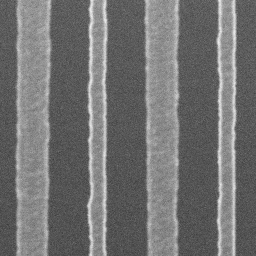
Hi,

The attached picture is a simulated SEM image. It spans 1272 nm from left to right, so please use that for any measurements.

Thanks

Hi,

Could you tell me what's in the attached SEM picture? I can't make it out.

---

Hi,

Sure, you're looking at lines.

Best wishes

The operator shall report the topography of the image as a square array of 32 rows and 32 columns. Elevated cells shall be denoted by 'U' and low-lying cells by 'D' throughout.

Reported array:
DDUUUUDDDDDUUDDDDDUUUUDDDDDUUDDD
DDUUUUDDDDDUUDDDDDUUUUDDDDDUUDDD
DDUUUUDDDDDUUDDDDDUUUUDDDDDUUDDD
DDDUUUDDDDDUUDDDDDUUUUDDDDDUUDDD
DDDUUUDDDDDUUDDDDDUUUUDDDDDUUDDD
DDUUUUDDDDDUUDDDDDUUUUDDDDDUUDDD
DDUUUUDDDDDUUDDDDDUUUUDDDDDUUDDD
DDUUUUDDDDDUUDDDDDDUUUDDDDDUUDDD
DDUUUUDDDDDUUDDDDDUUUUDDDDDUUDDD
DDUUUUDDDDDUUDDDDDDUUUDDDDDUUDDD
DDUUUUDDDDDUUDDDDDDUUUDDDDDDUDDD
DDUUUUDDDDDUUDDDDDDUUUDDDDDUUDDD
DDUUUUDDDDDUUDDDDDDUUUDDDDDUUDDD
DDUUUUDDDDDUUDDDDDDUUUDDDDDUUDDD
DDUUUUDDDDDUUDDDDDDUUUDDDDDUUDDD
DDUUUUDDDDDUUDDDDDDUUUDDDDDUUDDD
DDUUUUDDDDDUUDDDDDDUUUDDDDDUUDDD
DDUUUUDDDDDUUDDDDDDUUUDDDDDUUDDD
DDUUUUDDDDDUUDDDDDDUUUDDDDDUUDDD
DDUUUUDDDDDUUDDDDDDUUUDDDDDUUDDD
DDUUUUDDDDDUUDDDDDDUUUDDDDDUUDDD
DDUUUUDDDDDUUDDDDDDUUUDDDDDUUDDD
DDUUUUDDDDDUUDDDDDDUUUDDDDDUUDDD
DDUUUUDDDDDUUDDDDDDUUUDDDDDUUDDD
DDUUUUDDDDDUUDDDDDDUUUDDDDDUUDDD
DDUUUUDDDDDUUDDDDDDUUUDDDDDUUDDD
DDUUUUDDDDDUUDDDDDDUUUDDDDDUUDDD
DDUUUUDDDDDUUDDDDDDUUUDDDDDUUDDD
DDUUUUDDDDDUUDDDDDDUUUDDDDDUUDDD
DDUUUUDDDDDUUDDDDDDUUUDDDDDUUDDD
DDUUUUDDDDDUUDDDDDDUUUDDDDDUUDDD
DDUUUUDDDDDUUDDDDDDUUUDDDDDUUDDD